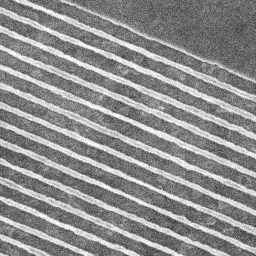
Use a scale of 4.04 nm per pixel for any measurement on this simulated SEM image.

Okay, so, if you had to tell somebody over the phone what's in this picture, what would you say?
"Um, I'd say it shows parallel lines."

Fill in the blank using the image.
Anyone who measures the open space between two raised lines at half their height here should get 51.1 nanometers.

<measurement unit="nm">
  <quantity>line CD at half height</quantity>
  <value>19.1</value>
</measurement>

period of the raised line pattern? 70.2 nanometers